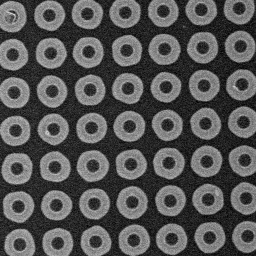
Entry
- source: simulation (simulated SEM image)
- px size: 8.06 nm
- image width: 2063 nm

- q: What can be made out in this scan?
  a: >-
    an array of small figures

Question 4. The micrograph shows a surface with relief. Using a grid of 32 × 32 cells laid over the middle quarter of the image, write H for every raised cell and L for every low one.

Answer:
LLLLHHHHLLLLLLLLLLLLLLLLLLLLLLLL
LLLLLLLLLLLLLLLLLLLLLLLLLLLLLLLL
LLLLLLLLLLLLLLHHHLLLLLLLHHHLLLLL
LLLLHHHHHLLLLHHHHHHLLLLHHHHHLLLL
LLLHHHHHHHLLLHHHHHHHLLHHHHHHHLLH
LLLHHHHHHHLLHHHHHHHHLLHHHHHHHLLH
HLLHHHHHHHLLHHHHHHHHLLHHHHHHHLLH
HLLHHHHHHHLLHHHHHHHLLLHHHHHHHLLL
LLLHHHHHHHLLLHHHHHHLLLLHHHHHLLLL
LLLLHHHHHLLLLLLHHHLLLLLLLHLLLLLL
LLLLLLLLLLLLLLLLLLLLLLLLLLLLLLLL
LLLLLLLLLLLLLLLLLLLLLLLLLLLLLLLL
LLLLLLHHLLLLLLHHHHHLLLLHHHHHLLLL
LLLLHHHHHHLLLHHHHHHHLLHHHHHHHLLL
HLLHHHHHHHLLLHHHHHHHLLHHHHHHHHLL
HLLHHHHHHHHLHHHHHHHHLLHHHHHHHLLL
HLLHHHHHHHHLLHHHHHHHLLHHHHHHHHLL
HLLHHHHHHHLLLHHHHHHHLLLHHHHHHLLL
LLLLHHHHHHLLLLHHHHHLLLLLHHHHLLLL
LLLLLHHHLLLLLLLLLLLLLLLLLLLLLLLL
LLLLLLLLLLLLLLLLLLLLLLLLLLLLLLLL
LLLLLLLLLLLLLLLLLHLLLLLLHHHHLLLL
LLLLHHHHHHLLLLHHHHHLLLLHHHHHHLLL
HLLLHHHHHHHLLHHHHHHHLLHHHHHHHHLL
HLLHHHHHHHHLLHHHHHHHHLHHHHHHHHLL
HHLHHHHHHHHLLHHHHHHHHLHHHHHHHHLL
HHLHHHHHHHHLLHHHHHHHLLLHHHHHHHLL
HLLLHHHHHHLLLLHHHHHHLLLHHHHHHLLL
HLLLLHHHHHLLLLLHHHLLLLLLLHHLLLLL
LLLLLLLLLLLLLLLLLLLLLLLLLLLLLLLL
LLLLLLLLLLLLLLLLLLLLLLLLLLHHLLLL
LLLLLLHHHHLLLLLHHHHLLLLLHHHHHLLL